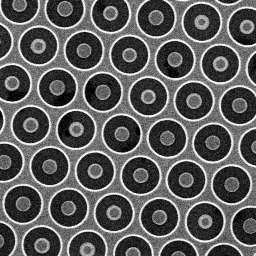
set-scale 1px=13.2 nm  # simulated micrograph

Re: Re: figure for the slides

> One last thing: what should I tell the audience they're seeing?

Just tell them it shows an array of small figures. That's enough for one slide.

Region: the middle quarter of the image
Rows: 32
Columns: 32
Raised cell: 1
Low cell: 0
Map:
11000000111100000000111000000000
11111111111110000000111100000000
00111111000111110111111110000001
00111100000001111111000111000111
00011100000000111100000011111110
00011000011000111000000001111000
00011000111100111000000000111000
00011000111000110000110000110000
00011000011000110000111000110001
00111100000000111000110000110001
11111110000001111000000001110001
11011111000011111100000011110000
00000011111111111110000111111000
00000001111100000111111111111100
00000000111000000011111000001111
00110000110000000001110000000011
00110000110001110001110000000011
00110000110001110001100001100001
00000001110001110001100011100001
00000001110000000001100011100001
00000111111000000011100000000011
11111111111100000111110000000011
11111000001111111111111000000111
01110000000111111000011111111111
01100000000011110000001111111000
01100001100011100000000111100000
01100011100001100011000011000000
01100011100001000011100011000010
11100000000011000011100011000111
11110000000011100001000011000111
11111000000111100000000111000010
00011110011111110000001111000000